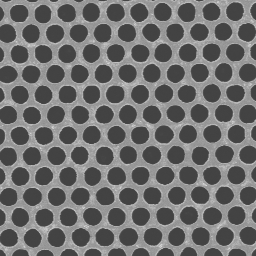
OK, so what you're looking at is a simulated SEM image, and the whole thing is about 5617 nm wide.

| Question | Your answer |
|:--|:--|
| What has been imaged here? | a regular array of holes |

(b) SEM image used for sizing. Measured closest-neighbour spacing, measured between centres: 512 nm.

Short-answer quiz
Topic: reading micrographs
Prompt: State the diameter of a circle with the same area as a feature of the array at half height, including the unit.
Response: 398 nanometers